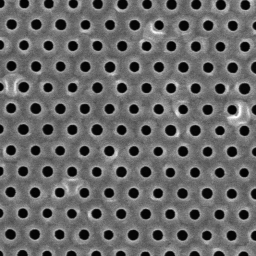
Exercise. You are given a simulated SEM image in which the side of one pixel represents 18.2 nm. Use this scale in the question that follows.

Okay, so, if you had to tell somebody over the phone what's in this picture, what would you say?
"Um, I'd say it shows a regular array of holes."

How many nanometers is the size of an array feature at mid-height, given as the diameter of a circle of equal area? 188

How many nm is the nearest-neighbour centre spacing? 437